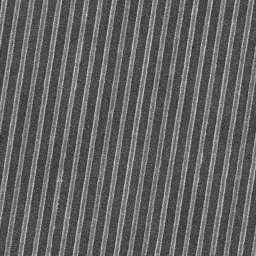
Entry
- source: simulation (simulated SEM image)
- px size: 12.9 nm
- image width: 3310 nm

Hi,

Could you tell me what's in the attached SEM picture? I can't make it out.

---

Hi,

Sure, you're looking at parallel lines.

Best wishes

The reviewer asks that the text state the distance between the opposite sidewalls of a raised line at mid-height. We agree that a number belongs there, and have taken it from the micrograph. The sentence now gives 63.9 nm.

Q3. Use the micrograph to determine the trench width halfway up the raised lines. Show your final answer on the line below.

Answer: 113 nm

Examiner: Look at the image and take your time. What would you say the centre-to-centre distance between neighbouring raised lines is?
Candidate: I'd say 13.6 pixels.